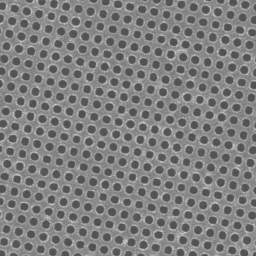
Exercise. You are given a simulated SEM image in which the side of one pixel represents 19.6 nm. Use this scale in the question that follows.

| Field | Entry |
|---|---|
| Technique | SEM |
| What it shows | a regular array of holes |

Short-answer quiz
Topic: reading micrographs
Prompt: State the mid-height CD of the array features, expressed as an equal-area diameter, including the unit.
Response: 169 nanometres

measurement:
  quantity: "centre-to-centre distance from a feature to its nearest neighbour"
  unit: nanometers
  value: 244